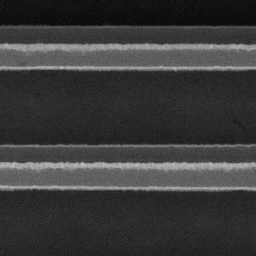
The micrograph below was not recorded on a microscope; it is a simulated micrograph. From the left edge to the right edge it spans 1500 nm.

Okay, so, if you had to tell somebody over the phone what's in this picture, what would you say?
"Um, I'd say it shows lines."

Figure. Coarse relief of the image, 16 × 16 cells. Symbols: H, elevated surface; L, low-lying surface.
LLLLLLLLLLLLLLLL
LLLLLLLLLLLLLLLL
HHHHHHHHHHHHHHHH
HHHHHHHHHHHHHHHH
LLLLLLLLLLLLLLLL
LLLLLLLLLLLLLLLL
LLLLLLLLLLLLLLLL
LLLLLLLLLLLLLLLL
LLLLLLLLLLLLLLLL
HHHHHHHHHHHHHHHH
HHHHHHHHHHHHHHHH
HHHHHHHHHHHHHHHH
LLLLLLLLLLLLLLLL
LLLLLLLLLLLLLLLL
LLLLLLLLLLLLLLLL
LLLLLLLLLLLLLLLL